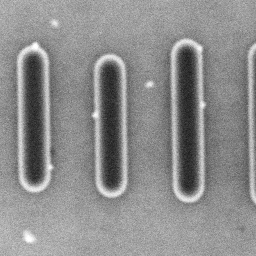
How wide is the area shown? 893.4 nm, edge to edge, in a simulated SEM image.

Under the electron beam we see groups of lines, slits or small figures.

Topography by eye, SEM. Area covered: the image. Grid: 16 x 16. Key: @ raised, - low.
----------------
----------------
----------------
-@@--------@@---
-@@---@@---@@---
-@@---@@---@@---
-@@---@@---@@---
-@@---@@---@@---
-@@---@@---@@---
-@@---@@---@@---
-@@---@@---@@---
-@@---@@---@@---
----------------
----------------
----------------
----------------